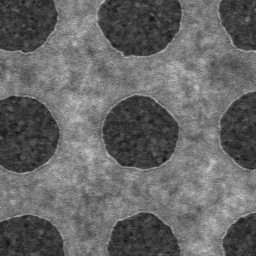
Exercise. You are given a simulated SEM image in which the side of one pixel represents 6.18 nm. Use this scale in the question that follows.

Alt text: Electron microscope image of raised bodies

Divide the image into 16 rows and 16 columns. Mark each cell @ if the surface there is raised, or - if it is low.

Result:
@@@@--@@@@@---@@
@@@@--@@@@@---@@
@@@----@@@@---@@
--------@-------
----------------
----------------
@@@----@@@----@@
@@@----@@@@---@@
@@@@--@@@@@---@@
@@@----@@@@---@@
@@------@@-----@
----------------
----------------
-@------@@-----@
@@@@---@@@@---@@
@@@@---@@@@---@@